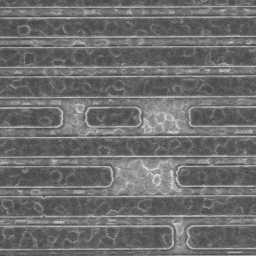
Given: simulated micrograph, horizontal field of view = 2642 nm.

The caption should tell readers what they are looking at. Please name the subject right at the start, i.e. parallel lines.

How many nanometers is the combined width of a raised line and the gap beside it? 310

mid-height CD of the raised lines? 0.213 um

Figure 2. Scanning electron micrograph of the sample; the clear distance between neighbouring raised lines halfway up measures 91.6 nanometers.